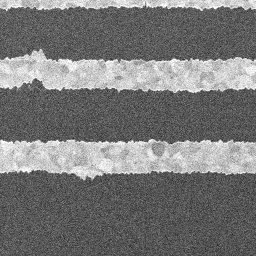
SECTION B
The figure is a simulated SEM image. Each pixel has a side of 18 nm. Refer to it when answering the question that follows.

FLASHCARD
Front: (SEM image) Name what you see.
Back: one or a few lines or trenches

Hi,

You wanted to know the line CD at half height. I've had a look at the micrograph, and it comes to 528 nm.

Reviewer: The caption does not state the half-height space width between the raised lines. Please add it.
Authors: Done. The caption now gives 957 nanometers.